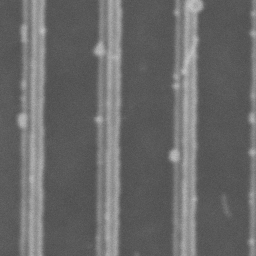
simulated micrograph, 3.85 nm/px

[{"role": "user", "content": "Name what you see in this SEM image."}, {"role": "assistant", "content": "lines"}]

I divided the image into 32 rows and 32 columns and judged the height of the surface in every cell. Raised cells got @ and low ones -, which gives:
---@@--------@@-------@@@-------
---@@--------@@-------@@@-------
---@@--------@@-------@@@-------
---@@--------@@-------@@@-------
---@@--------@@-------@@@-------
---@@-------@@@-------@@@-------
---@@-------@@@-------@@--------
---@@--------@@-------@@--------
---@@--------@@-------@@--------
---@@--------@@-------@@--------
---@@--------@@-------@@--------
---@@--------@@-------@@--------
---@@--------@@-------@@--------
---@@--------@@-------@@--------
--@@@-------@@@-------@@-------@
--@@@-------@@@-------@@--------
---@@-------@@@-------@@--------
---@@-------@@@-------@@--------
---@@-------@@@-------@@-------@
---@@-------@@@------@@@-------@
---@@-------@@@-------@@--------
---@@-------@@@-------@@--------
---@@-------@@@-------@@--------
---@@-------@@@-------@@--------
---@@-------@@@-------@@-------@
---@@-------@@@-------@@-------@
---@@-------@@@-------@@--------
---@@-------@@@-------@@--------
---@@-------@@@-------@@-------@
---@@-------@@@-------@@-------@
---@@-------@@@-------@@-------@
---@@-------@@@-------@@-------@